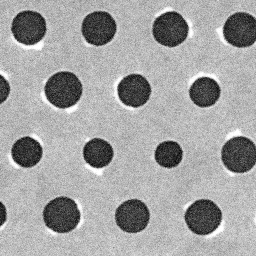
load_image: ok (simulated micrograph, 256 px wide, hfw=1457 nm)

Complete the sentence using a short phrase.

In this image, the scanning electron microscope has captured a regular array of holes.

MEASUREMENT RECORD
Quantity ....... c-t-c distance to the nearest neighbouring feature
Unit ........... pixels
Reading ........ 70.7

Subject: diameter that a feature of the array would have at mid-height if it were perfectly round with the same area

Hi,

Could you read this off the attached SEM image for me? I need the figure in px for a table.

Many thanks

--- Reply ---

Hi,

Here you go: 35.8